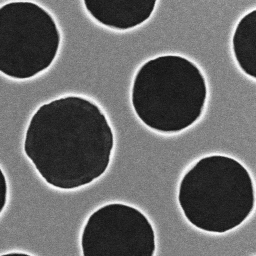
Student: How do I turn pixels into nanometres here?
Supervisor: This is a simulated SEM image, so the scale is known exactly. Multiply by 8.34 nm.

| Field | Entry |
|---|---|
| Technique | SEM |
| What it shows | holes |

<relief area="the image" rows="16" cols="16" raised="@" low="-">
---@@-----@@@@@@
---@@@---@@@@@@-
----@@@@@@@@@@@-
---@@@@@@@-@@@@-
--@@@@@@@----@@-
@@@@@@@@-----@@@
@@@---@@-----@@@
@@-----@@---@@@@
@@-----@@@@@@@@@
@@-----@@@@@@@@@
@@-----@@@@@---@
@@@--@@@@@@-----
@@@@@@@@@@@-----
@@@@@@---@@@---@
@@@@@-----@@@@@@
@@@@@-----@@@@@@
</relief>